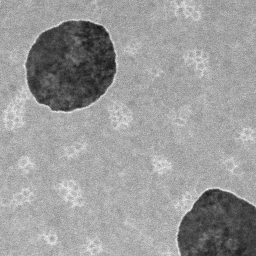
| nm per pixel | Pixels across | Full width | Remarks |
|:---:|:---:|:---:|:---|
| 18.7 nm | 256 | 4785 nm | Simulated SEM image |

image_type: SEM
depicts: holes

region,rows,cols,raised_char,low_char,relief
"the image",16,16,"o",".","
oooooooooooooooo
oooo..oooooooooo
oo.....ooooooooo
oo.....ooooooooo
oo.....ooooooooo
oo.....ooooooooo
ooo...oooooooooo
oooooooooooooooo
oooooooooooooooo
oooooooooooooooo
oooooooooooooooo
oooooooooooooooo
oooooooooooo...o
oooooooooooo....
ooooooooooo.....
ooooooooooo.....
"